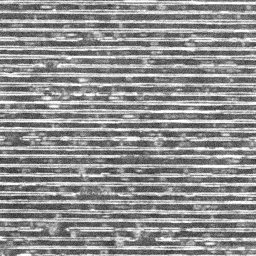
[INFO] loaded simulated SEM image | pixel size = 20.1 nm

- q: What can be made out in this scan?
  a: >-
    parallel lines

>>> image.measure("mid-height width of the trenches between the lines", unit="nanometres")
135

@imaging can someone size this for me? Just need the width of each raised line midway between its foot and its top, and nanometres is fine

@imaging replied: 40.1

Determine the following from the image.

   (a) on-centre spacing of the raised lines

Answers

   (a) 182 nm